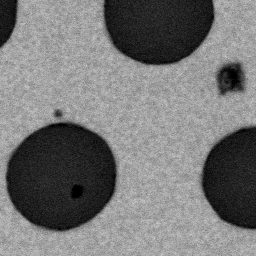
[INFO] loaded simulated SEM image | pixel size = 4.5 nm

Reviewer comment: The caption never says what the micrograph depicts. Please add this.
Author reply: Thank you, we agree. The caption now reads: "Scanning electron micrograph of holes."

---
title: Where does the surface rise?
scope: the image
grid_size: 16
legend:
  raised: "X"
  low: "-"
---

-XXXXXX------XXX
-XXXXXX------XXX
XXXXXXX------XXX
XXXXXXXX----XXXX
XXXXXXXXXXXXXXXX
XXXXXXXXXXXXXXXX
XXXXXXXXXXXXXXXX
XXXXXXXXXXXXXXXX
XX----XXXXXXXX--
X------XXXXXX---
-------XXXXXX---
-------XXXXXX---
X------XXXXXX---
X-----XXXXXXXX--
XXXXXXXXXXXXXXXX
XXXXXXXXXXXXXXXX